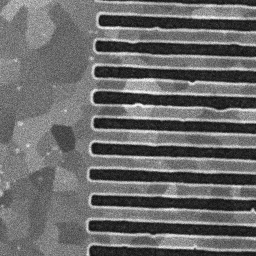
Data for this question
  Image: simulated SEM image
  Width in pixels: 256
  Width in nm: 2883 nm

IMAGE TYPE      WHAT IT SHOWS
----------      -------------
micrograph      parallel lines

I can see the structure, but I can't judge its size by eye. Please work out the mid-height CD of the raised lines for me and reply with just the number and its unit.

12.7 px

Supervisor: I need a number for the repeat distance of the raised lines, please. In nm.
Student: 289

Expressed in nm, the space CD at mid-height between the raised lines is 143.